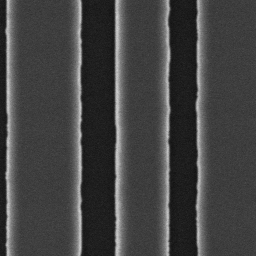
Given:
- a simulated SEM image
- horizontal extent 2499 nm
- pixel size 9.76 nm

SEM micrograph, lines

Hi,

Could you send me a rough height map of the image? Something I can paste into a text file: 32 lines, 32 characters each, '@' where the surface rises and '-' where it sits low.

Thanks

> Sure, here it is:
-@@@@@@@@@----@@@@@@@----@@@@@@@
-@@@@@@@@@----@@@@@@@----@@@@@@@
-@@@@@@@@@----@@@@@@@----@@@@@@@
-@@@@@@@@@----@@@@@@@----@@@@@@@
-@@@@@@@@@----@@@@@@@----@@@@@@@
-@@@@@@@@@-----@@@@@@----@@@@@@@
-@@@@@@@@@----@@@@@@@----@@@@@@@
-@@@@@@@@@----@@@@@@@----@@@@@@@
-@@@@@@@@@----@@@@@@@----@@@@@@@
-@@@@@@@@@----@@@@@@@----@@@@@@@
-@@@@@@@@@----@@@@@@@----@@@@@@@
-@@@@@@@@@----@@@@@@@----@@@@@@@
-@@@@@@@@@----@@@@@@@----@@@@@@@
-@@@@@@@@@----@@@@@@@----@@@@@@@
-@@@@@@@@@----@@@@@@@----@@@@@@@
-@@@@@@@@@-----@@@@@@----@@@@@@@
-@@@@@@@@@-----@@@@@@----@@@@@@@
-@@@@@@@@@-----@@@@@@----@@@@@@@
-@@@@@@@@@-----@@@@@@----@@@@@@@
-@@@@@@@@@----@@@@@@@----@@@@@@@
-@@@@@@@@@-----@@@@@@----@@@@@@@
-@@@@@@@@@-----@@@@@@----@@@@@@@
-@@@@@@@@@----@@@@@@@----@@@@@@@
-@@@@@@@@@----@@@@@@@----@@@@@@@
-@@@@@@@@@----@@@@@@@----@@@@@@@
-@@@@@@@@@----@@@@@@@----@@@@@@@
-@@@@@@@@@-----@@@@@@----@@@@@@@
-@@@@@@@@@-----@@@@@@----@@@@@@@
-@@@@@@@@@-----@@@@@@----@@@@@@@
-@@@@@@@@@-----@@@@@@----@@@@@@@
-@@@@@@@@@-----@@@@@@----@@@@@@@
-@@@@@@@@@----@@@@@@@----@@@@@@@